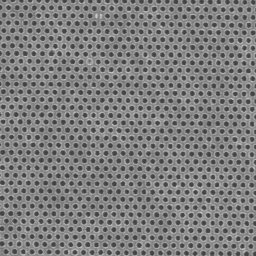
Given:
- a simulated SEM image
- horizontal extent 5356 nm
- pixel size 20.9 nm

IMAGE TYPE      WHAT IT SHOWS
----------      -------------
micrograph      a regular array of holes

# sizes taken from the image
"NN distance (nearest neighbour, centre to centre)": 173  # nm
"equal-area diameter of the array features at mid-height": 106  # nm